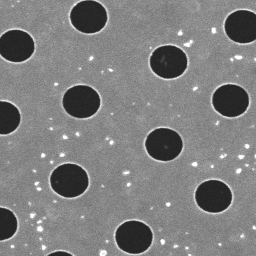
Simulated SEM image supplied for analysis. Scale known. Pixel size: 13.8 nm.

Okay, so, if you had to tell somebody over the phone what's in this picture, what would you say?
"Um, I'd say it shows holes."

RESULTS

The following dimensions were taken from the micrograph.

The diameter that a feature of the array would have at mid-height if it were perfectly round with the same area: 491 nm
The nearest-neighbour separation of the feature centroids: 1010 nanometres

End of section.